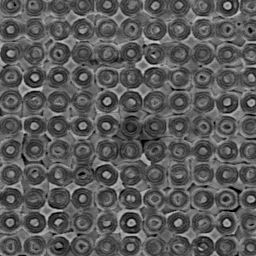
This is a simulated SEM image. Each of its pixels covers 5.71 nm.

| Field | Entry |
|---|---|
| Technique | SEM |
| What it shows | a regular array of ring-shaped raised bodies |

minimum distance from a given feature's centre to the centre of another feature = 130 nanometres